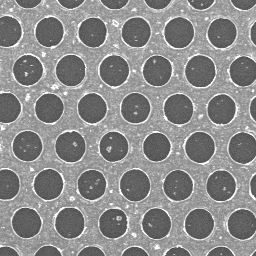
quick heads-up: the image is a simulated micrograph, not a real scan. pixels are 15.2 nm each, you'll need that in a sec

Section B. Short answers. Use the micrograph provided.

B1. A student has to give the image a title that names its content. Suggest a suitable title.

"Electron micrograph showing a regular array of holes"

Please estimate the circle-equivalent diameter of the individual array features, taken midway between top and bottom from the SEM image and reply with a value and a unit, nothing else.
462 nanometres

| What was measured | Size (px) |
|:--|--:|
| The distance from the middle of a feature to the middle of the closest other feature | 43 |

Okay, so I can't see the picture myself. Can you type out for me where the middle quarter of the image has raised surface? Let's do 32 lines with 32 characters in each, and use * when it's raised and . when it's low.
.....****.......****.......****.
.....****.......****.......***..
.....****.......****.......***..
.....****.......****.......****.
....******.....******.....*****.
*..********...********..********
********************************
******..********...*********..**
****......*****......*****.....*
****......*****......****.......
***........***........***.......
***........***........***.......
****.......***.......****.......
****......*****......*****......
******...*******...********....*
********************************
********************************
....******....********...*******
.....****......******.....*****.
.....****.......****......****..
......***.......****.......***..
......***.......****.......***..
.....****.......****......****..
....******.....******.....*****.
*..********..*******************
********************************
******..*********..*********.***
****......*****.....******.....*
****......****.......****.......
***........***........***.......
***........***........***.......
****......****.......****.......